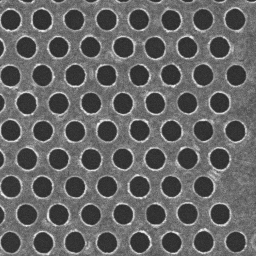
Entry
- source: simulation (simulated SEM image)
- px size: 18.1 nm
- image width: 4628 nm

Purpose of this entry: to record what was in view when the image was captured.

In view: a regular array of holes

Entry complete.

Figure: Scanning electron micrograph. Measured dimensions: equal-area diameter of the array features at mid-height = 373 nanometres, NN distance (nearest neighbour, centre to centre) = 0.573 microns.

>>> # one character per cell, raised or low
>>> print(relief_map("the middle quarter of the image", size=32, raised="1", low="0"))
11001111100011111100111110001111
10000111000001111000011100000111
00000111000001110000011100000111
00000111000001111000011100000111
10000111100001111000011110000111
11001111110111111100111111111111
11111111111111111111111111111111
11111000111111001111100011111000
01110000011110000111000001111000
01110000011100000111000001110000
01110000011100000111000001110000
01111000011110000111100001111000
11111111111111011111111111111111
11111111111111111111111111111111
11001111110011111000111111001111
10000111000001111000011110000111
00000111000001110000001100000011
10000111000001111000011100000111
10000111100001111000011110000111
11011111111011111111111111111111
11111111111111111111111111111111
11111100111110001111100011111000
01111000011100000111000001111000
01110000011100000111000000110000
01110000011100000111000001110000
01111000011110000111100001111000
11111101111111111111111111111111
11111111111111111111111111111111
10001111100011111000111110001111
10000111100001110000011100000111
00000111000001110000011100000111
00000111000001110000011100000111